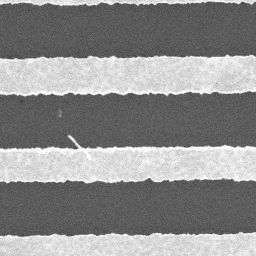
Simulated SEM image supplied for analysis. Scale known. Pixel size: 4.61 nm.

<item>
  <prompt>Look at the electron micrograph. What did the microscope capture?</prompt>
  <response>lines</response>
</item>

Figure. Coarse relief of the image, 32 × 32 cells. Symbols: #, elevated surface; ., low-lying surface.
....#..###.#....................
................................
................................
................................
................................
................................
................................
################################
################################
################################
################################
#######################.#######.
................................
................................
................................
................................
................................
................................
......................#....##...
################################
################################
################################
########.#########.###.......###
................................
................................
................................
................................
................................
................................
.#..#.##.#######################
################################
################################